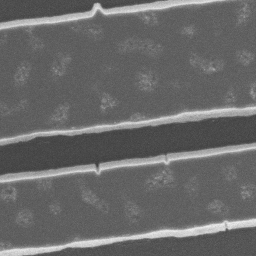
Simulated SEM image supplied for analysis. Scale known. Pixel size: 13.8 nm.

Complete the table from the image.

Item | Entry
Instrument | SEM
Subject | one or a few lines or trenches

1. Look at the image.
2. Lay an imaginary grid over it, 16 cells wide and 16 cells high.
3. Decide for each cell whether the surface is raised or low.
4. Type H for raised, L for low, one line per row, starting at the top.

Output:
LLLLLLLLLHHHHHHH
LHHHHHHHHHHHHHHH
HHHHHHHHHHHHHHHH
HHHHHHHHHHHHHHHH
HHHHHHHHHHHHHHHH
HHHHHHHHHHHHHHHH
HHHHHHHHHHHHHHHH
HHHHHHHHHHLLLLLL
HHLLLLLLLLLLLLLL
LLLLLLLLLLLLLHHH
LLLLLLHHHHHHHHHH
HHHHHHHHHHHHHHHH
HHHHHHHHHHHHHHHH
HHHHHHHHHHHHHHHH
HHHHHHHHHHHHLLLL
HHHHLLLLLLLLLLLL